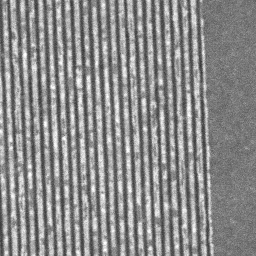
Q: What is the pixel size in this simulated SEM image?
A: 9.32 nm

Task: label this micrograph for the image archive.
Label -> parallel lines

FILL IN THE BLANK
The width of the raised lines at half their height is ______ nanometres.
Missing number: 34.9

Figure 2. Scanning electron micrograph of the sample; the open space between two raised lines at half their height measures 44.2 nm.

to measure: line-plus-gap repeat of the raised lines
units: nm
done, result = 83.7